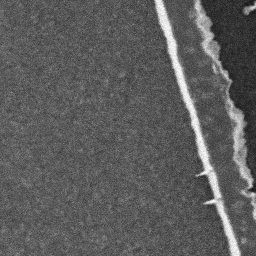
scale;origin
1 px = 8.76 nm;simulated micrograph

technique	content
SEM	one or a few lines or trenches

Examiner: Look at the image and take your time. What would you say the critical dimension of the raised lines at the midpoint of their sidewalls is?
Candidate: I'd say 351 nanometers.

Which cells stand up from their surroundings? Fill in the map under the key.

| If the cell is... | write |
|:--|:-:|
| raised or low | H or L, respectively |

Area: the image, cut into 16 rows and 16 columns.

LLLLLLLLLLHHHLLL
LLLLLLLLLLHHHLLL
LLLLLLLLLLLHHLLL
LLLLLLLLLLLHHLLL
LLLLLLLLLLLHHHLL
LLLLLLLLLLLHHHLL
LLLLLLLLLLLLHHLL
LLLLLLLLLLLLHHHL
LLLLLLLLLLLLHHHL
LLLLLLLLLLLLLHHL
LLLLLLLLLLLLLHHL
LLLLLLLLLLLLLHHH
LLLLLLLLLLLLLLHH
LLLLLLLLLLLLLLHH
LLLLLLLLLLLLLLHH
LLLLLLLLLLLLLLLH